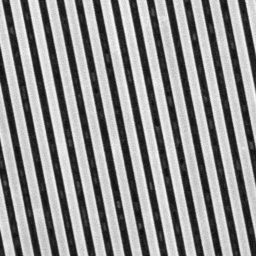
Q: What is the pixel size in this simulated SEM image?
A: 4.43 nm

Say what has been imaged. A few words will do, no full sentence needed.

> parallel lines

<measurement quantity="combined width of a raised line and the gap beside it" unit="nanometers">78.8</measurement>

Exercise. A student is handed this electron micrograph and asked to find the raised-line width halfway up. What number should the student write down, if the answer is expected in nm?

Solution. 42.9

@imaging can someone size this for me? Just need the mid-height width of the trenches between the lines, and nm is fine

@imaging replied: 34.3